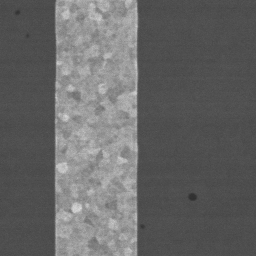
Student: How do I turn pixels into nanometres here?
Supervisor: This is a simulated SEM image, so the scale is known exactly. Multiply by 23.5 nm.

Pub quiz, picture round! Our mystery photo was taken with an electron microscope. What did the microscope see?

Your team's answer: wiring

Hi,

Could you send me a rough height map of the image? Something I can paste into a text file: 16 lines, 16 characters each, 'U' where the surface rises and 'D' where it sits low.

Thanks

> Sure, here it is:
DDDDUUUUUDDDDDDD
DDDDUUUUUDDDDDDD
DDDDUUUUUDDDDDDD
DDDDUUUUUDDDDDDD
DDDDUUUUUDDDDDDD
DDDDUUUUUDDDDDDD
DDDDUUUUUDDDDDDD
DDDDUUUUUDDDDDDD
DDDDUUUUUDDDDDDD
DDDDUUUUUDDDDDDD
DDDDUUUUUDDDDDDD
DDDDUUUUUDDDDDDD
DDDDUUUUUDDDDDDD
DDDDUUUUUDDDDDDD
DDDDUUUUUDDDDDDD
DDDDUUUUUDDDDDDD